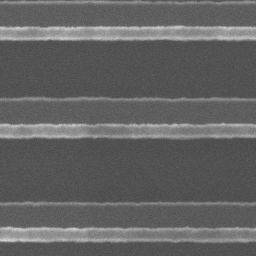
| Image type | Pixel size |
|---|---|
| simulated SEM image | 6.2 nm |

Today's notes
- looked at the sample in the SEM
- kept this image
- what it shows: lines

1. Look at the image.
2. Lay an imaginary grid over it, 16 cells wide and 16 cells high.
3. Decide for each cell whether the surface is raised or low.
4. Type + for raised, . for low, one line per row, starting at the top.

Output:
++++++++++++++++
++++++++++++++++
+...............
................
................
................
++++++++++++++++
++++++++++++++++
++++++++++++++++
................
................
................
................
++++++++++++++++
++++++++++++++++
................